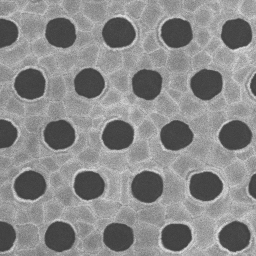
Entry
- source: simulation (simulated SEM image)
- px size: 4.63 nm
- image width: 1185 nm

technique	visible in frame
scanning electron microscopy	a regular array of holes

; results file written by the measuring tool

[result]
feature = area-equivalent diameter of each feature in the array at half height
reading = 141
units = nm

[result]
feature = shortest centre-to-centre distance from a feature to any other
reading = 268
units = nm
